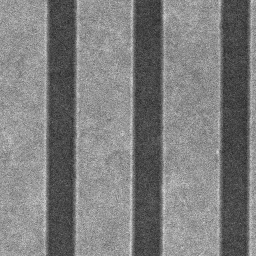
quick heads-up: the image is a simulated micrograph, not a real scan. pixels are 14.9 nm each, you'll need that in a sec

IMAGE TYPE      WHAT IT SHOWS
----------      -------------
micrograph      one or a few lines or trenches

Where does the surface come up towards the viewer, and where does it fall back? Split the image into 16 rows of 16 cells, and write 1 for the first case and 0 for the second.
1110011100111100
1110011100111100
1110011100111100
1110011100111100
1110011100111100
1110011100111100
1110011100111100
1110011100111100
1110011100111100
1110011100111100
1110011100111100
1110011100111100
1110011100111100
1110011100111100
1110011100111100
1110011100111100